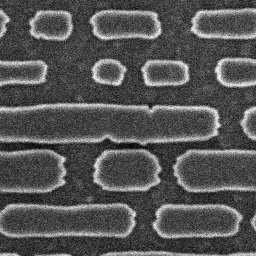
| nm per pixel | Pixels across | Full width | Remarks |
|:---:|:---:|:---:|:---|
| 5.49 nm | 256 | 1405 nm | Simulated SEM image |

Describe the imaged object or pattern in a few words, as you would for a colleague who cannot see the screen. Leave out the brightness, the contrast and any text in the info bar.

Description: parallel lines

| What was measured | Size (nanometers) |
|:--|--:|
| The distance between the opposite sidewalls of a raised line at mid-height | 172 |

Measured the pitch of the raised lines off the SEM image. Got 270 nanometers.